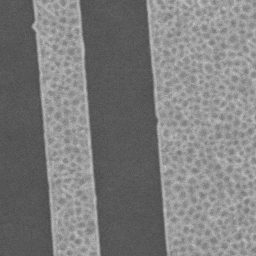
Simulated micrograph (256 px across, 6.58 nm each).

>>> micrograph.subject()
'one or a few lines or trenches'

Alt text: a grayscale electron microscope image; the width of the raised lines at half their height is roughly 284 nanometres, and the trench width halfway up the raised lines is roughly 455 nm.